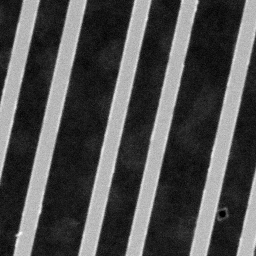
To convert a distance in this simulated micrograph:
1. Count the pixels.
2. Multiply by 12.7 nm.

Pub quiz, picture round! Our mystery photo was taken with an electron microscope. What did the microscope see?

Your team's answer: parallel lines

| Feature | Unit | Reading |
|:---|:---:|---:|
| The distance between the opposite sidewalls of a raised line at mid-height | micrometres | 0.198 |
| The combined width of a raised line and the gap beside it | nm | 706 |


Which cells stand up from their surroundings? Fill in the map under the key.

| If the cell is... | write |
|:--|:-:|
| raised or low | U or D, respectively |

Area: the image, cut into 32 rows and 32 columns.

DDDUUDDDDUUDDDDDDUUDDDDUUDDDDDDU
DDDUUDDDUUDDDDDDDUUDDDUUDDDDDDUU
DDUUDDDDUUDDDDDDUUDDDDUUDDDDDDUU
DDUUDDDDUUDDDDDDUUDDDDUUDDDDDDUU
DDUUDDDDUUDDDDDDUUDDDDUUDDDDDDUU
DDUUDDDDUUDDDDDDUUDDDDUUDDDDDDUU
DDUDDDDUUDDDDDDUUDDDDUUDDDDDDUUD
DUUDDDDUUDDDDDDUUDDDDUUDDDDDDUUD
DUUDDDDUUDDDDDDUUDDDDUUDDDDDDUUD
DUUDDDDUUDDDDDDUUDDDDUUDDDDDDUUD
DUUDDDUUDDDDDDDUUDDDUUDDDDDDUUDD
UUDDDDUUDDDDDDUUDDDDUUDDDDDDUUDD
UUDDDDUUDDDDDDUUDDDDUUDDDDDDUUDD
UUDDDDUUDDDDDDUUDDDDUUDDDDDDUUDD
UUDDDDUUDDDDDDUUDDDDUUDDDDDDUUDD
UUDDDUUDDDDDDDUDDDDUUDDDDDDUUDDD
UDDDDUUDDDDDDUUDDDDUUDDDDDDUUDDD
UDDDDUUDDDDDDUUDDDDUUDDDDDDUUDDD
UDDDDUUDDDDDDUUDDDDUUDDDDDDUUDDD
UDDDUUDDDDDDDUUDDDDUDDDDDDUUUDDD
DDDDUUDDDDDDUUDDDDUUDDDDDDUUDDDD
DDDDUUDDDDDDUUDDDDUUDDDDDDUUDDDD
DDDDUUDDDDDDUUDDDDUUDDDDDDUUDDDD
DDDDUUDDDDDDUUDDDDUUDDDDDDUUDDDD
DDDUUDDDDDDUUDDDDUUDDDDDDUUDDDDU
DDDUUDDDDDDUUDDDDUUDDDDDDUUDDDDU
DDDUUDDDDDDUUDDDDUUDDDDDDUUDDDDU
DDDUUDDDDDDUUDDDDUUDDDDDDUUDDDDU
DDDUDDDDDDDUUDDDDUDDDDDDDUUDDDUU
DDUUDDDDDDUUDDDDUUDDDDDDUUDDDDUU
DDUUDDDDDDUUDDDDUUDDDDDDUUDDDDUU
DDUUDDDDDDUUDDDDUUDDDDDDUUDDDDUU